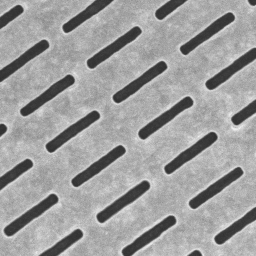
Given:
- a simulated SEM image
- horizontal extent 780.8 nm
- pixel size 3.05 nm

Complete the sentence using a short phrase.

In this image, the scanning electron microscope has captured a regular array of holes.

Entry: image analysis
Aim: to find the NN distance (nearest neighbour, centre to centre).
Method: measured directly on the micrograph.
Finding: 132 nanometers